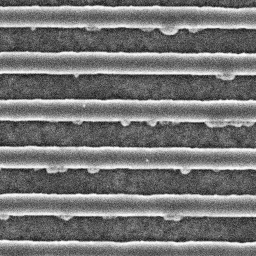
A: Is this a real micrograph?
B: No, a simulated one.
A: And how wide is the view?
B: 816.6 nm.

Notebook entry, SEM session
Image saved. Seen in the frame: lines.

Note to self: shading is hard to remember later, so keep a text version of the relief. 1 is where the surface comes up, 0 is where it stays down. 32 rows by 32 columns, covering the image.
00000000000000000000000000000000
11111111111111111111111111111111
11111111111111111111111111111111
00000000000000000000110110000011
00000000000000000000000000000000
00000000000000000000000000000000
00000000000000000000000000000000
11111111111111111111111111111111
11111111111111111111111111111111
00000000000000000000000000001000
00000000000000000000000000000000
00000000000000000000000000000000
00000000000000000000000000000000
11111111111111111111111111111111
11111111111111111111111111111111
00000000000000000000000000110000
00000000000000000000000000000000
00000000000000000000000000000000
11111110001011100000000000000000
11111111111111111111111111111111
11111111111111111111111111111111
00000000000000000000000000000000
00000000000000000000000000000000
00000000000000000000000000000000
11111111111111111001111110000000
11111111111111111111111111111111
11111111111111111111111111111111
00000000000000000000000000000000
00000000000000000000000000000000
00000000000000000000000000000000
11111111111111111111111111111111
11111111111111111111111111111111